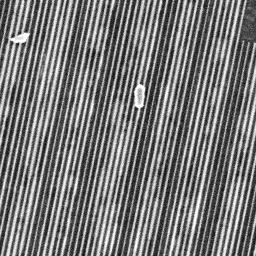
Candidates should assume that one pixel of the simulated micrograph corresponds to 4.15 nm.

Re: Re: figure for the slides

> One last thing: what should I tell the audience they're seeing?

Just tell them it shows parallel lines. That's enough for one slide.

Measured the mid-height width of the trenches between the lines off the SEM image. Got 19.8 nm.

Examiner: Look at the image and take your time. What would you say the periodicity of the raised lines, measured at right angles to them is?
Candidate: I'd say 0.0244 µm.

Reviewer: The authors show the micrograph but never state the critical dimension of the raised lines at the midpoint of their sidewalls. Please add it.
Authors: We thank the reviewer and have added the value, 7.6 nanometres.